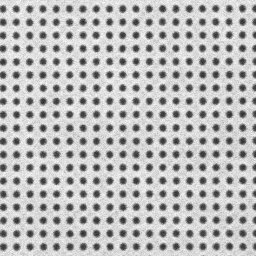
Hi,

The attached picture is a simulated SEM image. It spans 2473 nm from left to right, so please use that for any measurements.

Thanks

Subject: a regular array of holes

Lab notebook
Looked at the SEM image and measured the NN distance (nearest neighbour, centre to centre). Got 126 nanometres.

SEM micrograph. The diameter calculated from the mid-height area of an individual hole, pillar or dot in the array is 73.9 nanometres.